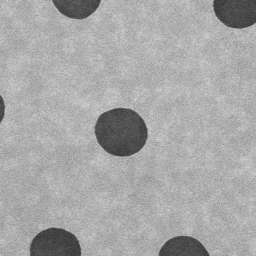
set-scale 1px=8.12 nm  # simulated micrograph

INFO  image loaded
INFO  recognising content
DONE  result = holes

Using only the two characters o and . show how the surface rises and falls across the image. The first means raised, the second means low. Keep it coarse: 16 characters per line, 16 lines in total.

oooo..ooooooo...
oooooooooooooo..
oooooooooooooooo
oooooooooooooooo
oooooooooooooooo
oooooooooooooooo
oooooooooooooooo
oooooo...ooooooo
oooooo...ooooooo
ooooooo..ooooooo
oooooooooooooooo
oooooooooooooooo
oooooooooooooooo
oooooooooooooooo
ooo.oooooooooooo
oo...ooooo...ooo